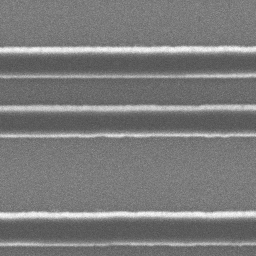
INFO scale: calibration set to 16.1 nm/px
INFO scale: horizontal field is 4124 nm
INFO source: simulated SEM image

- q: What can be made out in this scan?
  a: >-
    lines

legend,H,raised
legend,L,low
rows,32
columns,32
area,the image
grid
LLLLLLLLLLLLLLLLLLLLLLLLLLLLLLLL
LLLLLLLLLLLLLLLLLLLLLLLLLLLLLLLL
LLLLLLLLLLLLLLLLLLLLLLLLLLLLLLLL
LLLLLLLLLLLLLLLLLLLLLLLLLLLLLLLL
LLLLLLLLLLLLLLLLLLLLLLLLLLLLLLLL
LLLLLLLLLLLLLLLLLLLLLLLLLLLLLLLL
HHHHHHHHHHHHHHHHHHHHHHHHHHHHHHHH
HHHHHHHHHHHHHHHHHHHHHHHHHHHHHHHH
HHHHHHHHHHHHHHHHHHHHHHHHHHHHHHHH
HHHHHHHHHHHHHHHHHHHHHHHHHHHHHHHL
LLLLLLLLLLLLLLLLLLLLLLLLLLLLLLLL
LLLLLLLLLLLLLLLLLLLLLLLLLLLLLLLL
LLLLLLLLLLLLLLLLLLLLLLLLLLLLLLLL
LLLLLLLLLLLLLLLLLHHHLLLLLHHHHHHH
HHHHHHHHHHHHHHHHHHHHHHHHHHHHHHHH
HHHHHHHHHHHHHHHHHHHHHHHHHHHHHHHH
HHHHHHHHHHHHHHHHHHHHHHHHHHHHHHHH
LLLLLLLLLLLLLLLLLLLLLLLLLLLLLLLL
LLLLLLLLLLLLLLLLLLLLLLLLLLLLLLLL
LLLLLLLLLLLLLLLLLLLLLLLLLLLLLLLL
LLLLLLLLLLLLLLLLLLLLLLLLLLLLLLLL
LLLLLLLLLLLLLLLLLLLLLLLLLLLLLLLL
LLLLLLLLLLLLLLLLLLLLLLLLLLLLLLLL
LLLLLLLLLLLLLLLLLLLLLLLLLLLLLLLL
LLLLLLLLLLLLLLLLLLLLLLLLLLLLLLLL
LLLLLLLLLLLLLLLLLLLLLLLLLLLLLLLL
LLLLLLLLLLLLLLLLLLLLLLLLLLLLLLLL
HHHHHHHHHHHHHHHHHHHHHHHHHHHHHHHH
HHHHHHHHHHHHHHHHHHHHHHHHHHHHHHHH
HHHHHHHHHHHHHHHHHHHHHHHHHHHHHHHH
HHHHHHHHHHHHHHHHHHHHHHHHHHHHHHHH
LLLLLLLLLLLLLLLLLLLLLLLLLLLLLLLL